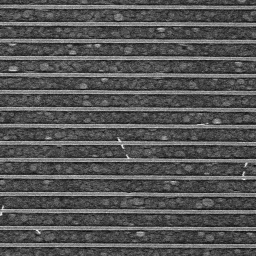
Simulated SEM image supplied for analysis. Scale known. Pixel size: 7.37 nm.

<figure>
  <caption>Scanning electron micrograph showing parallel lines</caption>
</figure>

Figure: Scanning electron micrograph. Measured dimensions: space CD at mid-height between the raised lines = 98.6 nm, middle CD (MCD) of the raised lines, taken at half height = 24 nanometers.